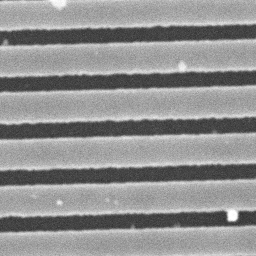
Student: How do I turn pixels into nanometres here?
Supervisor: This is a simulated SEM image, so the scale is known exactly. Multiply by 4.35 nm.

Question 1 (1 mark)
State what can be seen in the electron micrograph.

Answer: lines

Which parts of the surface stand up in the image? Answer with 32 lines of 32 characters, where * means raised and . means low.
********************************
********************************
********************************
*********.......................
................................
.............*******************
********************************
********************************
********************************
***.............................
................................
.....***************************
********************************
********************************
********************************
................................
................................
...*****************************
********************************
********************************
**************************......
................................
................................
********************************
********************************
********************************
**********************......**..
................................
.....................***********
********************************
********************************
********************************